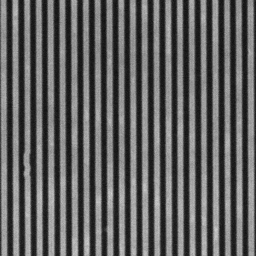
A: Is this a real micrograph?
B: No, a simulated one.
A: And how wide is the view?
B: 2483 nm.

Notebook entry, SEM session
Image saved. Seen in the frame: parallel lines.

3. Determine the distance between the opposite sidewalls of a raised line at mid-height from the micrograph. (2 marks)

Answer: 46.1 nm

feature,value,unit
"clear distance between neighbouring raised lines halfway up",0.0631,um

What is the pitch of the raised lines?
114 nm